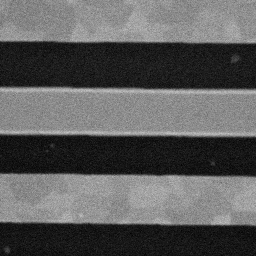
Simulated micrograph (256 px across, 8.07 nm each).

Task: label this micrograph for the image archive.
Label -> lines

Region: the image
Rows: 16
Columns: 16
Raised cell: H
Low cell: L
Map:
HHHHHHHHHHHHHHHH
HHHHHHHHHHHHHHHH
HHHHHHHHHHHHHHHH
LLLLLLLLLLLLLLLL
LLLLLLLLLLLLLLLL
HLLLLLLLLLLLLLLL
HHHHHHHHHHHHHHHH
HHHHHHHHHHHHHHHH
LLLLLLLLLLLLLLHH
LLLLLLLLLLLLLLLL
LLLLLLLLLLLLLLLL
HHHHHHHHHHHHHHHH
HHHHHHHHHHHHHHHH
HHHHHHHHHHHHHHHH
LLLLLLLLLLLLLLLL
LLLLLLLLLLLLLLLL